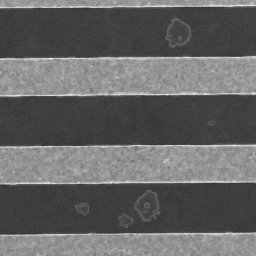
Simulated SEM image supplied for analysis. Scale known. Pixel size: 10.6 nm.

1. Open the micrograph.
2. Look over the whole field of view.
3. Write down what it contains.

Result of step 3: wiring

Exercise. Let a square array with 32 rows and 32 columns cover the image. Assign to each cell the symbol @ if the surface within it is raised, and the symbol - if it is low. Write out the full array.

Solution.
@@@@@@@@@@@@@@@@@@@@@@@@@@@@@@@@
--------------------------------
--------------------------------
----------------------@---------
----------------------@---------
--------------------------------
--------------------------------
@@@@@@@@@@@@@@@@@@@@@@@@@@@@@@@@
@@@@@@@@@@@@@@@@@@@@@@@@@@@@@@@@
@@@@@@@@@@@@@@@@@@@@@@@@@@@@@@@@
@@@@@@@@@@@@@@@@@@@@@@@@@@@@@@@@
@@@@@@@@@@@@@@@@@@@@@@@@@@@@@@@@
--------------------------------
--------------------------------
--------------------------------
--------------------------------
--------------------------------
--------------------------------
@@@@@@@@@@@@@@@@@@@@@@@@@@@@@@@@
@@@@@@@@@@@@@@@@@@@@@@@@@@@@@@@@
@@@@@@@@@@@@@@@@@@@@@@@@@@@@@@@@
@@@@@@@@@@@@@@@@@@@@@@@@@@@@@@@@
@@@@@@@@@@@@@@@@@@@@@@@@@@@@@@@@
--------------------------------
--------------------------------
------------------@-------------
------------------@-------------
--------------------------------
--------------------------------
@@@@@@@@@@@@@@@@@@@@@@@@@@@@@@@@
@@@@@@@@@@@@@@@@@@@@@@@@@@@@@@@@
@@@@@@@@@@@@@@@@@@@@@@@@@@@@@@@@